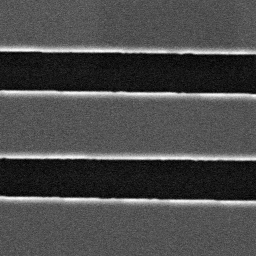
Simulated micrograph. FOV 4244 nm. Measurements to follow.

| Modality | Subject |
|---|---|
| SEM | lines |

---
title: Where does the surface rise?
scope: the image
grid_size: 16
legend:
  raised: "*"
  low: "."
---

****************
****************
****************
................
................
................
****************
****************
****************
****************
................
................
**********......
****************
****************
****************